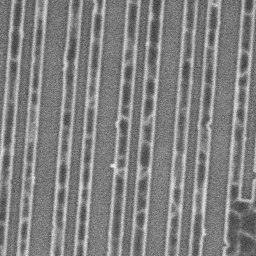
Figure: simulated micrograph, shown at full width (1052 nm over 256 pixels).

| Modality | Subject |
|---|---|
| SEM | parallel lines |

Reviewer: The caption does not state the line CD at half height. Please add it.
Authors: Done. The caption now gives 48.6 nm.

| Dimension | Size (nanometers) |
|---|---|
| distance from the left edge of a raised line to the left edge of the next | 118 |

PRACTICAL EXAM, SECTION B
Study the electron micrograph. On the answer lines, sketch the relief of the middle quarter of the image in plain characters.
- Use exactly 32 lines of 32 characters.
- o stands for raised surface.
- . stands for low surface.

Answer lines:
ooo...ooo......ooo..ooo......ooo
ooo...ooo......ooo..oooo.....ooo
ooo...ooo......ooo..ooo......ooo
ooo...ooo.....ooo...ooo......ooo
ooo...oo......ooo...ooo......ooo
ooo...oo......ooo...ooo......ooo
ooo...oo......ooo...ooo......oo.
ooo...oo......ooo...ooo......oo.
oo....oo......ooo...ooo......oo.
oo....oo......ooo...ooo.....ooo.
oo...ooo......ooo...ooo.....ooo.
oo...ooo......ooo...ooo.....ooo.
oo...ooo......ooo...ooo.....ooo.
oo...ooo......ooo..ooo......ooo.
oo...ooo.....ooo...ooo......ooo.
oo...ooo.....ooo...ooo......ooo.
oo...ooo......oo...ooo......ooo.
oo...ooo.....ooo...ooo......ooo.
oo...oo......ooo...ooo......ooo.
oo...oo......ooo...ooo......ooo.
oo...oo......ooo...ooo......oo..
o....oo......ooo...ooo......oo..
o....oo......ooo...ooo.....ooo..
o...ooo......ooo...ooo.....ooo..
o...ooo......ooo...ooo.....ooo..
o...ooo.....oooo...ooo.....ooo..
o...ooo......ooo..ooo......ooo..
o...ooo......ooo..ooo......ooo..
o...ooo......oo...ooo......ooo..
o...ooo......oo...ooo......ooo..
o...ooo.....ooo...ooo......o.o..
o...oo......ooo...ooo......ooo..